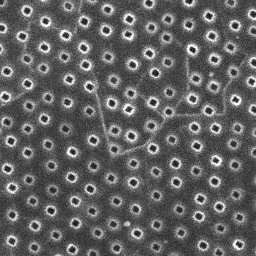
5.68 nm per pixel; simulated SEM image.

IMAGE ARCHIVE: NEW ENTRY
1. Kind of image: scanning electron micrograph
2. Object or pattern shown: a regular array of holes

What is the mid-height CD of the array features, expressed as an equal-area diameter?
42.5 nm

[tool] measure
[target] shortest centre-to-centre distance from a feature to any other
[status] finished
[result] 116 nm